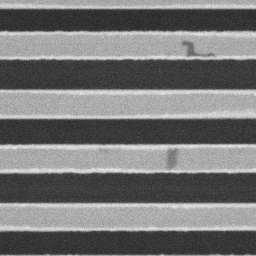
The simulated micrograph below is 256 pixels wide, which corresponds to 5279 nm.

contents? lines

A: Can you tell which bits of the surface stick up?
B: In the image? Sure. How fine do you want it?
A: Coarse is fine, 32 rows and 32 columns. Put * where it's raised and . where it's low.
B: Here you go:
********************************
................................
................................
................................
********************************
********************************
********************************
................................
................................
................................
................................
********************************
********************************
********************************
********************************
................................
................................
................................
********************************
********************************
********************************
********************************
................................
................................
................................
********************************
********************************
********************************
********************************
................................
................................
................................